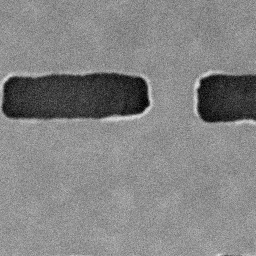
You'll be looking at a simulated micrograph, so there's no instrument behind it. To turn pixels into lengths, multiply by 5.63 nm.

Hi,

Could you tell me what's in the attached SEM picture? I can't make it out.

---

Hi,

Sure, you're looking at holes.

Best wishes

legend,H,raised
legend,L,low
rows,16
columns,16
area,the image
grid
HHHHHHHHHHHHHHHH
HHHHHHHHHHHHHHHH
HHHHHHHHHHHHHHHH
HHHHHHHHHHHHHHHH
HHHHHHHHHHHHHHHH
LLLLLLLLLHHHLLLL
LLLLLLLLLHHHLLLL
HLLLHHHHHHHHHLLH
HHHHHHHHHHHHHHHH
HHHHHHHHHHHHHHHH
HHHHHHHHHHHHHHHH
HHHHHHHHHHHHHHHH
HHHHHHHHHHHHHHHH
HHHHHHHHHHHHHHHH
HHHHHHHHHHHHHHHH
HHHHHHHHHHHHHHHH